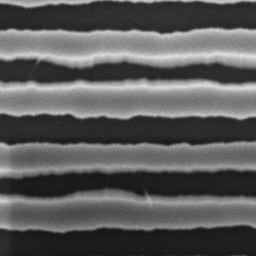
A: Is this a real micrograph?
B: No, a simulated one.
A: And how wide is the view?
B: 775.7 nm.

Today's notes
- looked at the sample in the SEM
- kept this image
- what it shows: lines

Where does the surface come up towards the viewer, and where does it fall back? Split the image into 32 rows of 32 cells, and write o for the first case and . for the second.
.oooooo..o......................
................................
................................
................................
oooooooooooooooooooooooooooooooo
oooooooooooooooooooooooooooooooo
oooooooooooooooooooooooooooooooo
.......ooooo......ooooo......ooo
................................
................................
.........oo.....ooo...ooooo.....
oooooooooooooooooooooooooooooooo
oooooooooooooooooooooooooooooooo
oooooooooooooooooooooooooooooooo
.........oooooooo..ooooo.oo.oooo
................................
................................
................................
oooooooooooooooooooooooooooooooo
oooooooooooooooooooooooooooooooo
oooooooooooooooooooooooooooooooo
oooooo.o........................
................................
................................
.........ooooooo................
oooooooooooooooooooooooooooooooo
oooooooooooooooooooooooooooooooo
oooooooooooooooooooooooooooooooo
oooooooooooo...ooooooooo........
................................
................................
................................